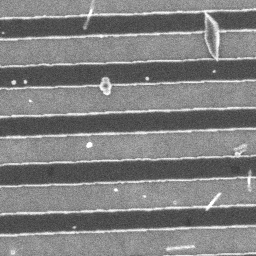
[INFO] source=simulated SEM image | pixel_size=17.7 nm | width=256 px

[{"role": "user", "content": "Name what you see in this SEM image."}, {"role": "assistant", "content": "lines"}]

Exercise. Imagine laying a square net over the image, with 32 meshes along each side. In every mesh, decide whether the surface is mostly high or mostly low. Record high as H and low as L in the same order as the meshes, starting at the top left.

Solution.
LLLLLLLLLLLLLLLLLLLLLLLLLLLLLLLL
LLLLLLLLLLLLLLLLLLLLLLLLHHHHHHHH
HHHHHHHHHHHHHHHHHHHHHHHHHHHHHHHH
HHHHHHHHHHHHHHHHHHHHHHHHHHHHHHHH
HHHHHHHHHHHHHLLLLLLLLLLLLLHLLLLL
LLLLLLLLLLLLLLLLLLLLLLLLLLHLLLLL
LLLLLLLLLLLLLLLLLLLLLLLLLLHLLLLL
LLLLLLLLLLLLLLLLLLLLLLLLHHHHHHHH
HHHHHHHHHHHHHHHHHHHHHHHHHHHHHHHH
HHHHHHHHHHHHHHHHHHHHHHHHHHHHHHHH
HHHHHHHHHHHHHHHHHLLLLLLLLLLLLLLL
LLLLLLLLLLLLLHLLLLLLLLLLLLLLLLLL
LLLLLLLLLLLLLLLLLLLLLLLLLLLLLLLL
LLLLLLLLLLLLLLLLLLLLLLLLLLLLLHHH
LLHHHHHHHHHHHHHHHHHHHHHHHHHHHHHH
HHHHHHHHHHHHHHHHHHHHHHHHHHHHHHHH
HHHHHHHHHHHHHHHHHHHHHLLLLLLLLLLL
LLLLLLLLLLLLLLLLLLLLLLLLLLLLLLLL
LLLLLLLLLLLLLLLLLLLLLLLLLLLLLLLL
LLLLLLLLLLLLLLLLLLLLLLLLLLLLLHLH
LLHHHHHHHHHHHHHHHHHHHHHHHHHHHHHH
HHHHHHHHHHHHHHHHHHHHHHHHHHHHHHHH
HHHHHHHHHHHHHHHHHHHHHHHHHLLLLLLL
LLLLLLLLLLLLLLLLLLLLLLLLLLLLLLLL
LLLLLLLLLLLLLLLLLLLLLLLLLLLLLLLL
LLLLLLLLLLLLLLLLLLLLLLLLLLLLLLLL
LLLLLLHHHHHHHHHHHHHHHHHHHHHHHHHH
HHHHHHHHHHHHHHHHHHHHHHHHHHHHHHHH
HHHHHHHHHHHHHHHHHHHHHHHLLLLLLLLL
LLLLLLLLLLLLLLLLLLLLLLLLLLLLLLLL
LLLLLLLLLLLLLLLLLLLLLLLLLLLLLLLL
LLLLLLLLLLLLLLLLLLLLLLLLLLLLLLLL